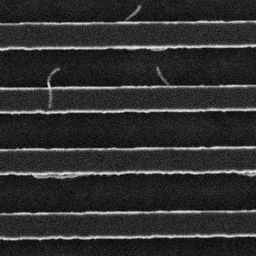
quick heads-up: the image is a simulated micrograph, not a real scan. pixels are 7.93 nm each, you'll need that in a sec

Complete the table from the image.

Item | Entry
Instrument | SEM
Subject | lines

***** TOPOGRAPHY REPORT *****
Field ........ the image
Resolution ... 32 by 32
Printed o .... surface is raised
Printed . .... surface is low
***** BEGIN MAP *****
................................
................................
................................
oooooooooooooooooooooooooooooooo
oooooooooooooooooooooooooooooooo
oooooooooooooooooooooooooooooooo
................................
................................
................................
................................
................................
oooooooooooooooooooooooooooooooo
oooooooooooooooooooooooooooooooo
oooooooooooooooooooooooooooooooo
................................
................................
................................
................................
...........................ooooo
oooooooooooooooooooooooooooooooo
oooooooooooooooooooooooooooooooo
ooooooooooooooooooooooooooooooo.
................................
................................
................................
................................
...................o.ooooooooooo
oooooooooooooooooooooooooooooooo
oooooooooooooooooooooooooooooooo
oooooooooooooooooooooooooooooooo
................................
................................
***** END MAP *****